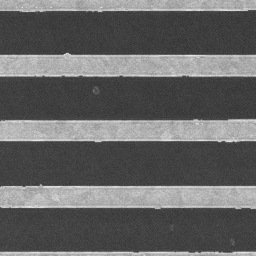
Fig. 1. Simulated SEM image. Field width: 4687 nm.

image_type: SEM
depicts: lines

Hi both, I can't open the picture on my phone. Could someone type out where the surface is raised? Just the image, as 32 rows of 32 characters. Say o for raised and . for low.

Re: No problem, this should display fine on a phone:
oooooooooooooooooooooooooooooooo
................................
................................
................................
................................
................................
................................
oooooooooooooooooooooooooooooooo
oooooooooooooooooooooooooooooooo
................................
................................
................................
................................
................................
................................
oooooooooooooooooooooooooooooooo
oooooooooooooooooooooooooooooooo
oooo.ooooooooooooooooooooooooooo
................................
................................
................................
................................
................................
oooooooooooooooooooooooooooooooo
oooooooooooooooooooooooooooooooo
oooooooooooooooooooooooooooooooo
................................
................................
................................
................................
................................
................................